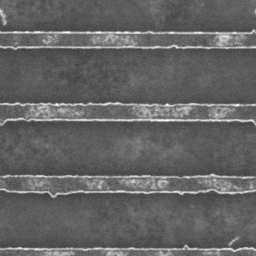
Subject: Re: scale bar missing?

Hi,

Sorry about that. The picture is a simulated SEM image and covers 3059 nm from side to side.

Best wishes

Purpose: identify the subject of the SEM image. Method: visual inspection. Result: one or a few lines or trenches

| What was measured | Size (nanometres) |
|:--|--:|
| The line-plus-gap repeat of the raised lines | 863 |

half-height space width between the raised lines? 677 nanometers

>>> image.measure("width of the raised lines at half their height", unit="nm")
187